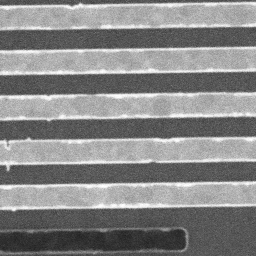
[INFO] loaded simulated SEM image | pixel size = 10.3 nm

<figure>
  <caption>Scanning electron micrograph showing parallel lines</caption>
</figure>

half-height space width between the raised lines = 0.225 um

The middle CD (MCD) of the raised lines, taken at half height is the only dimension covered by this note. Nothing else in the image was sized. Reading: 234 nanometres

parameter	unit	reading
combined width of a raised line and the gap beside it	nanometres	461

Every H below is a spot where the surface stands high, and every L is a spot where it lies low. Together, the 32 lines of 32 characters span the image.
LLLLLLLLLLLLLLLLLLLLLLLLLLLLLHHH
HHHHHHHHHHHHHHHHHHHHHHHHHHHHHHHH
HHHHHHHHHHHHHHHHHHHHHHHHHHHHHHHH
HHHHHHHHHHLLLLLLLLLLLLLLLLLLLLLL
LLLLLLLLLLLLLLLLLLLLLLLLLLLLLLLL
LLLLLLLLLLLLLLLLLLLLLLLLLLLLLLLL
HHHHHHHHHHHHHHHHHHHHHHHHHHHHHHHH
HHHHHHHHHHHHHHHHHHHHHHHHHHHHHHHH
HHHHHHHHHHHHHHHHHHHHHHHHHHHHHHHH
LLLLLLLLLLLLLLLLLLLLLLLLLLLLLLLL
LLLLLLLLLLLLLLLLLLLLLLLLLLLLLLLL
LLLLLLLLLLLLLLLLLLLLLLLLLLLLLLLL
HHHHHHHHHHHHHHHHHHHHHHHHHHHHHHHH
HHHHHHHHHHHHHHHHHHHHHHHHHHHHHHHH
HHHHHHHHHHHHHHHHHHHHLLHHHHHHLLLL
LLLLLLLLLLLLLLLLLLLLLLLLLLLLLLLL
LLLLLLLLLLLLLLLLLLLLLLLLLLLLLLLL
LLLLLLLLLLLLLLLLLHHHLHHHHHHHHHHH
HHHHHHHHHHHHHHHHHHHHHHHHHHHHHHHH
HHHHHHHHHHHHHHHHHHHHHHHHHHHHHHHH
HHLLLLLLLLLLLLLLLLLLLLLLLLLLLLLL
LLLLLLLLLLLLLLLLLLLLLLLLLLLLLLLL
LLLLLLLLLLLLLLLLLLLLLLLLLLLLLLLL
HHHHHHHHHHHHHHHHHHHHHHHHHHHHHHHH
HHHHHHHHHHHHHHHHHHHHHHHHHHHHHHHH
HHHHHHHHHHHHHHHHHHHHHHHHHHHHHHHH
LLLLLLLLLLLLLLLLLLLLLLLLLLLLLLLL
LLLLLLLLLLLLLLLLLLLLLLLLLLLLLLLL
LLLLLLLLLLLLLLLLLLLLLLLLLLLLLLLL
HHHHHHHHHHHHHHHHHHHHHHHLLLLLLLLL
HHHHHHHHHHHHHHHHHHHHHHHLLLLLLLLL
HHHHHHHHLLLHLLLLLLLLLLLLLLLLLLLL